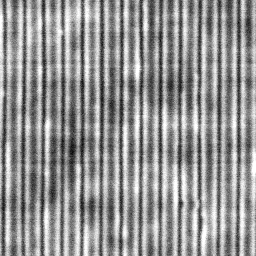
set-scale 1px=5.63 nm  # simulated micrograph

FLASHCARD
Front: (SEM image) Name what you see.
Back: parallel lines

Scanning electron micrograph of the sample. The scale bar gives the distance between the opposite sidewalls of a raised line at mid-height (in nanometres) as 83.1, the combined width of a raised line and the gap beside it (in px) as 19.5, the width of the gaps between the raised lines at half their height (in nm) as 29.6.